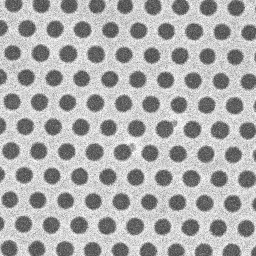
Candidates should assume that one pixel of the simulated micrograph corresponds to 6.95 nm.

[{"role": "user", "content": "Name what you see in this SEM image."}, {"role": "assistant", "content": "a regular array of holes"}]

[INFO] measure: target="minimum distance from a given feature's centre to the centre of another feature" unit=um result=0.192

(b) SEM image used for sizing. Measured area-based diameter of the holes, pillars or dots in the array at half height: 125 nm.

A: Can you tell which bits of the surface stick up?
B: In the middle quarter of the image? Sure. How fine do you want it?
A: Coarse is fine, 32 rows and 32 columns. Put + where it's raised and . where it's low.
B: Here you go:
++++++++++++++++++++++++++++++++
++++.+++++++++++++.+++++++++++++
++....++++...++++...++++...++++.
++.....++.....++.....++.....++..
++....+++.....++.....++.....++..
+++...++++...++++...++++...+++..
++++++++++++++++++++++++++++++++
..++++++++++++++++++++++++++++++
...+++....+++....+++...++++...++
...++.....+++....++.....+++....+
...+++....+++....++.....++.....+
..++++...++++....+++....+++....+
++++++++++++++++++++++++++++.+++
++++++++++++++++++++++++++++++++
++....++++...++++...++++....+++.
++.....++....+++....+++.....++..
++.....++....+++.....++....+++..
+++...+++....+++....+++....+++..
++++++++++++++++++++++++..+++++.
++++++++++++++++++++++++++++++++
...+++...++++.....++...+++++..++
...++.....++......+.....+++...++
...++.....++.....++.....++.....+
..++++....+++....+++....+++....+
+++++++++++++++++++++.++++++.+++
++++++++++++++++++++++++++++++++
++....++++..+++++..+++++..+++++.
++....+++....+++....+++....+++..
++....+++....++.....+++....+++..
++....+++....+++....+++....+++..
+++.+++++++++++++..+++++..+++++.
++++++++++++++++++++++++++++++++